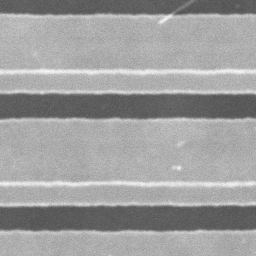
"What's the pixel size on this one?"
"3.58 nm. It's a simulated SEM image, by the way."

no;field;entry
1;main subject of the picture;lines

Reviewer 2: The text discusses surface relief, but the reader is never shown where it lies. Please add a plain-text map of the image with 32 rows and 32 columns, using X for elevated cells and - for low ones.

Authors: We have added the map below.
--------------------------------
--------------------------------
XXXXXXXXXXXXXXXXXXXXXXXXXXXXXXXX
XXXXXXXXXXXXXXXXXXXXXXXXXXXXXXXX
XXXXXXXXXXXXXXXXXXXXXXXXXXXXXXXX
XXXXXXXXXXXXXXXXXXXXXXXXXXXXXXXX
XXXXXXXXXXXXXXXXXXXXXXXXXXXXXXXX
XXXXXXXXXXXXXXXXXXXXXXXXXXXXXXXX
XXXXXXXXXXXXXXXXXXXXXXXXXXXXXXXX
XXXXXXXXXXXXXXXXXXXXXXXXXXXXXXXX
XXXXXXXXXXXXXXXXXXXXXXXXXXXXXXXX
XXXXXXXXXXXXXXXXXXXXXXXXXXXXXXXX
--------------------------------
--------------------------------
--------------------------------
XXXXXXXXXXXXXXXXXXXXXXXXXXXXXXXX
XXXXXXXXXXXXXXXXXXXXXXXXXXXXXXXX
XXXXXXXXXXXXXXXXXXXXXXXXXXXXXXXX
XXXXXXXXXXXXXXXXXXXXXXXXXXXXXXXX
XXXXXXXXXXXXXXXXXXXXXXXXXXXXXXXX
XXXXXXXXXXXXXXXXXXXXXXXXXXXXXXXX
XXXXXXXXXXXXXXXXXXXXXXXXXXXXXXXX
XXXXXXXXXXXXXXXXXXXXXXXXXXXXXXXX
XXXXXXXXXXXXXXXXXXXXXXXXXXXXXXXX
XXXXXXXXXXXXXXXXXXXXXXXXXXXXXXXX
XXXXXXXXXXXXXXXXXXXXXXXXXXXXXXXX
--------------------------------
--------------------------------
--------------------------------
XXXXXXXXXXXXXXXXXXXXXXXXXXXXXXXX
XXXXXXXXXXXXXXXXXXXXXXXXXXXXXXXX
XXXXXXXXXXXXXXXXXXXXXXXXXXXXXXXX